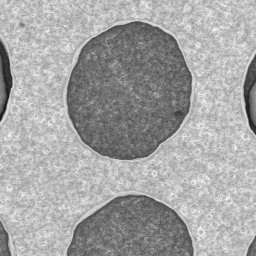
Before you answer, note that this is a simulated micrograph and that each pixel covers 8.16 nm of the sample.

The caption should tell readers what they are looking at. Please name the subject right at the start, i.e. holes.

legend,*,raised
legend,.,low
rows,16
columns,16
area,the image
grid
****************
********.*******
******.....*****
.****......*****
.***........***.
.***........***.
****........***.
****.......****.
*****......*****
******....******
****************
****************
*******...******
******.....*****
*****.......****
.***........****